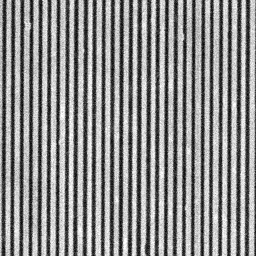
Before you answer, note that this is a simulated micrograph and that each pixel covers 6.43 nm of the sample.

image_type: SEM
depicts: parallel lines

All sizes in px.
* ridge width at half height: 4.76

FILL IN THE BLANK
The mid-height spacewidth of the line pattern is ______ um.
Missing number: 0.0306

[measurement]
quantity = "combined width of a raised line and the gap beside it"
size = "0.0581 micrometres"